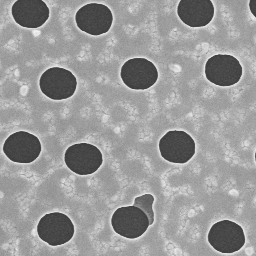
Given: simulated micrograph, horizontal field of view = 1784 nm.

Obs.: a regular array of holes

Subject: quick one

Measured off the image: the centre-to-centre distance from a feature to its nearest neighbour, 516 nanometers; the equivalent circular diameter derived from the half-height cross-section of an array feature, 0.241 micrometres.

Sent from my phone